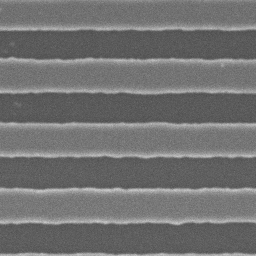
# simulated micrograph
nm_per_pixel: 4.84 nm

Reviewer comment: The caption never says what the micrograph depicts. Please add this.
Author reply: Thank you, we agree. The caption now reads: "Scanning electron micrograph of lines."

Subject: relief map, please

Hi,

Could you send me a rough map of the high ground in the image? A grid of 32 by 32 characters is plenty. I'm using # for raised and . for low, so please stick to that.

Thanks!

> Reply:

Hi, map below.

################################
################################
################################
################################
................................
................................
................................
####.....########.#######..##...
################################
################################
################################
#####...#..#.##########...#.####
................................
................................
................................
#######.################.#######
################################
################################
################################
################################
................................
................................
................................
................................
################################
################################
################################
################################
................................
................................
................................
................................